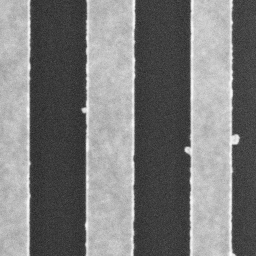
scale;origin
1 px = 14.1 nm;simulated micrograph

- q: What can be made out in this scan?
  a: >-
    lines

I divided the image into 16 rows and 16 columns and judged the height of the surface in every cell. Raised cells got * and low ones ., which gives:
**...***....**..
**...***....**..
**...***....**..
**...***....**..
**...***....**..
**...***....**..
**...***....**..
**...***....**..
**...***....**..
**...***....**..
**...***....**..
**...***....**..
**...***....**..
**...***....**..
**...***....**..
**...***....**..